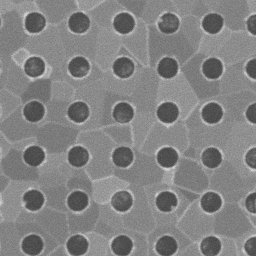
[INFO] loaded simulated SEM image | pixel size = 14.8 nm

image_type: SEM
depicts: a regular array of holes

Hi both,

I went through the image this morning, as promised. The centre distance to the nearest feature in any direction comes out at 651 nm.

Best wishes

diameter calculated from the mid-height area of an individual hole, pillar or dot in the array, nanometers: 329